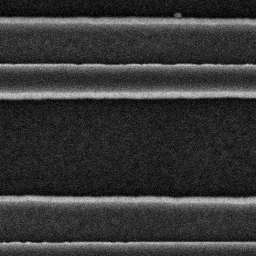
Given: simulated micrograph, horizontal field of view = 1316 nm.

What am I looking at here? lines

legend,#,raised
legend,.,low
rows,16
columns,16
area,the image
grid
................
################
################
################
################
################
................
................
................
................
................
................
#####....#......
################
################
################